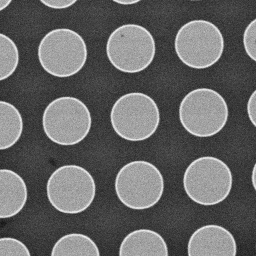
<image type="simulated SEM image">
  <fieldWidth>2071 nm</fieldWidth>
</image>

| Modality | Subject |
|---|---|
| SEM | an array of small figures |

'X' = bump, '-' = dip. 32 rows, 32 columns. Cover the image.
X-----XXX-----------------------
--------------------------------
--------------------------------
---------------XXX-----XXXX----X
X-----XXXX----XXXXX---XXXXXX---X
XX---XXXXXX--XXXXXX---XXXXXX---X
XX---XXXXXX--XXXXXX---XXXXXX---X
XX---XXXXXX---XXXXX----XXXX-----
XX---XXXXX-----XXX--------------
X------XX-----------------------
--------------------------------
------------------------XXX-----
-------XXX-----XXXX----XXXXX---X
XX----XXXXX---XXXXXX---XXXXX---X
XXX--XXXXXX---XXXXXX---XXXXX---X
XXX--XXXXXX---XXXXXX---XXXXX----
XXX---XXXXX----XXXX-----XXX-----
XX-----XXX------X---------------
X-------------------------------
--------------------------------
----------------XXX-----XXXX----
XX-----XXXX----XXXXX---XXXXXX---
XXX---XXXXXX---XXXXX---XXXXXX---
XXX---XXXXXX--XXXXXX---XXXXXX---
XXX---XXXXXX---XXXXX----XXXX----
XXX----XXXX-----XXX------XX-----
XX------XX----------------------
--------------------------------
-------------------------XXX----
--------XXX-----XXXX----XXXXX---
XXX----XXXXX---XXXXXX---XXXXX---
XXXX---XXXXX---XXXXXX---XXXXX---